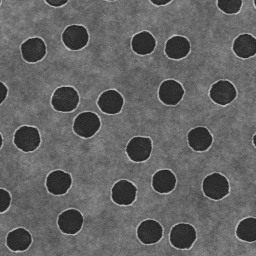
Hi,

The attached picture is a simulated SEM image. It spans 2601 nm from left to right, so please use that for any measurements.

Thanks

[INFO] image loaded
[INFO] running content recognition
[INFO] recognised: a regular array of holes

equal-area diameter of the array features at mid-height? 0.263 microns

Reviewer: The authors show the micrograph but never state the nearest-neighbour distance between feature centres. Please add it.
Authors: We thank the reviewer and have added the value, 420 nm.